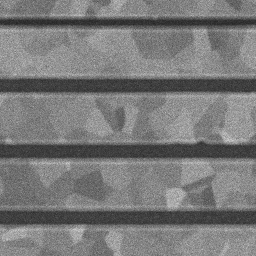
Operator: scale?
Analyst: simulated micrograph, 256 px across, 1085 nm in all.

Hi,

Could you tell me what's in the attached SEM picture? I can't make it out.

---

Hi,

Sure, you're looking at one or a few lines or trenches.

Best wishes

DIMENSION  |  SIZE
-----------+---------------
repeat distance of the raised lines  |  280 nanometers